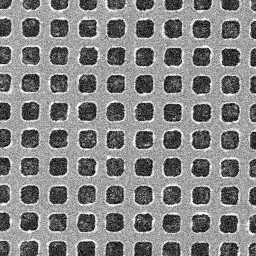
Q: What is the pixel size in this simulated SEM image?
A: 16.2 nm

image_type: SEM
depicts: a regular array of holes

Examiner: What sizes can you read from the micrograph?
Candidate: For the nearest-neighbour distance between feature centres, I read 445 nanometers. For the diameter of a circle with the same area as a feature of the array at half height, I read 327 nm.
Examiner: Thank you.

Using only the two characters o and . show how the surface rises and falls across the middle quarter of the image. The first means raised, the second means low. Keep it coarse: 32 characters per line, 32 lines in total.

oooooooooooo..oooo...ooooo..oooo
oooooooooooooooooooooooooooooooo
ooooo..ooooooooooooooooooooooooo
.ooo....ooo....ooo....ooo....ooo
.oo.....ooo....ooo.....oo.....oo
.oo.....ooo....ooo.....oo.....oo
.ooo....ooo....ooo....ooo....ooo
ooooo.ooooooooooooo.oooooo..oooo
oooooooooooooooooooooooooooooooo
oooooooooooo..oooooo..oooooooooo
.ooo....ooo....ooo....ooo....ooo
.oo.....oo.....ooo....ooo.....oo
.oo.....oo.....ooo....ooo.....oo
.ooo....ooo....ooo....ooo.....oo
oooooooooooo..ooooo.ooooooo.oooo
oooooooooooooooooooooooooooooooo
ooooo..ooooo..oooooooooooooooooo
.ooo....ooo....ooo....ooo....ooo
.ooo....oo.....ooo....ooo.....oo
.ooo....oo.....ooo....ooo.....oo
.ooo....ooo....ooo....ooo....ooo
oooooooooooooooooooooooooooooooo
oooooooooooooooooooooooooooooooo
ooooo.ooooo...ooooo..ooooo...ooo
.oo.....ooo....ooo....ooo....ooo
.oo.....oo.....oo.....ooo....ooo
.oo.....oo.....oo.....ooo....ooo
oooo....ooo....ooo....ooo....ooo
oooooooooooooooooooooooooooooooo
oooooooooooooooooooooooooooooooo
oooo....oooo..ooooo..ooooo..oooo
.ooo....ooo....ooo....ooo....ooo